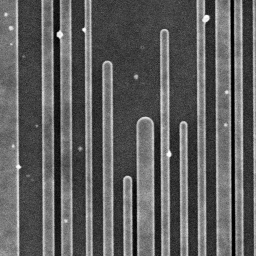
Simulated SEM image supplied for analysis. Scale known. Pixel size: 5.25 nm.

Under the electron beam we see groups of lines, slits or small figures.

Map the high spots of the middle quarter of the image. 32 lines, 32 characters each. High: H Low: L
HHLLLHHLLLHHLLLLLLLLLLLLHHLLLLLL
HHLLLHHLLLHHLLLLLLLLLLLLHHLLLLLL
HHLLLHHLLLHHLLLLLLLLLLLLHHLLLLLL
HHLLLHHLLLHHLLLLLLLLLLLLHHLLLLLL
HHLLLHHLLLHHLLLLLLLLLLLLHHLLLLLL
HHLLLHHLLLHHLLLLLLLLLLLLHHLLLLLL
HHLLLHHLLLHHLLLLLLLLLLLLHHLLLLLL
HHLLLHHLLLHHLLLLLLLLLLLLHHLLLLLL
HHLLLHHLLLHHLLLLLLLLLLLLHHLLLLLL
HHLLLHHLLLHHLLLLLLLLLLLLHHLLLLLL
HHLLLHHLLLHHLLLLLLLLLLLLHHLLLLLL
HHLLLHHLLLHHLLLLLLLLLLLLHHLLLLLL
HHLLLHHLLLHHLLLLLLLLLLLLHHLLLLLL
HHLLLHHLLLHHLLLLLLLLHLLLHHLLLLLL
HHLLLHHLLLHHLLLLLLLHHHLLHHLLLLLL
HHLLLHHLLLHHLLLLLLHHHHLLHHLLLHHL
HHLLLHHLLLHHLLLLLLHHHHLLHHLLLHHL
HHLLLHHLLLHHLLLLLLHHHHLLHHLLLHHL
HHLLLHHLLLHHLLLLLLHHHHLLHHLLLHHL
HHLLLHHLLLHHLLLLLLHHHHLLHHLLLHHL
HHLLLHHLLLHHLLLLLLHHHHLLHHLLLHHL
HHLLLHHLLLHHLLLLLLHHHHLLHHLLLHHL
HHLLLHHLLLHHLLLLLLHHHHLLHHHLLHHL
HHLLLHHLLLHHLLLLLLHHHHLLHHLLLHHL
HHLLLHHLLLHHLLLLLLHHHHLLHHLLLHHL
HHLLLHHLLLHHLLLLLLHHHHLLHHLLLHHL
HHLLLHHLLLHHLLLLLLHHHHLLHHLLLHHL
HHLLLHHLLLHHLLLLLLHHHHLLHHLLLHHL
HHLLLHHLLLHHLLLHHLHHHHLLHHLLLHHL
HHLLLHHLLLHHLLLHHLHHHHLLHHLLLHHL
HHLLLHHLLLHHLLLHHLHHHHLLHHLLLHHL
HHLLLHHLLLHHLLLHHLHHHHLLLHLLLHHL